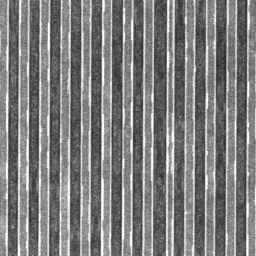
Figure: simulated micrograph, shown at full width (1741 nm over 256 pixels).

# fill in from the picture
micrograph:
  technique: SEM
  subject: parallel lines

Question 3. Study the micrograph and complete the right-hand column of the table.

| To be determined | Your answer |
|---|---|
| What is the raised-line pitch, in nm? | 141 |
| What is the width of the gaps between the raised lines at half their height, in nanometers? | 80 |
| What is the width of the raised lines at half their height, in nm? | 60.4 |